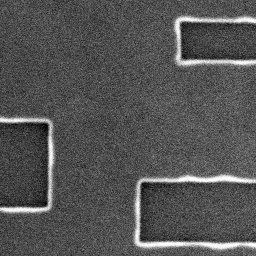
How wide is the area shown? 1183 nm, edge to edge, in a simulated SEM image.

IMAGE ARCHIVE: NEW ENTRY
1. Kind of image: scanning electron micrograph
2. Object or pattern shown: groups of lines, slits or small figures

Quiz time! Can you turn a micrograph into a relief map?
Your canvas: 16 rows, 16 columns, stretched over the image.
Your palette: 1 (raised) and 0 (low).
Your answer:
1111111111111111
1111111111100000
1111111111100000
1111111111100000
1111111111111111
1111111111111111
1111111111111111
1111111111111111
0001111111111111
0001111111111111
0001111111111111
0001111110000000
0001111110000000
1111111110000000
1111111110000000
1111111111111111